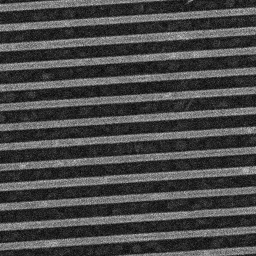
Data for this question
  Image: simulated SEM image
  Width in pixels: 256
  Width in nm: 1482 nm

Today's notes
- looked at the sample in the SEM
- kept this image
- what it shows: parallel lines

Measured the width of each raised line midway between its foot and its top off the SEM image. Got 39 nanometers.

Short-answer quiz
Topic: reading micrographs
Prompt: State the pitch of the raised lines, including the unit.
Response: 115 nm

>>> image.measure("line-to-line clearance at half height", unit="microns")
0.073